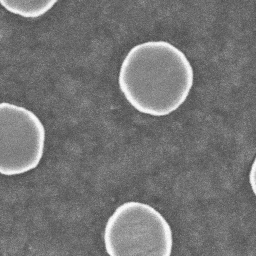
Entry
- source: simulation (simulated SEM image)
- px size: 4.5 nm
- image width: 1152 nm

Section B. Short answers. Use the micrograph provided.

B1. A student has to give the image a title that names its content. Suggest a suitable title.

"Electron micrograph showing raised bodies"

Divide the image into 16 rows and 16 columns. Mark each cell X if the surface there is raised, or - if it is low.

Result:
XXX-------------
----------------
----------------
--------XXX-----
--------XXXX----
--------XXXX----
--------XXX-----
XX--------------
XXX-------------
XXX-------------
XX--------------
----------------
----------------
-------XXX------
-------XXXX-----
-------XXXX-----